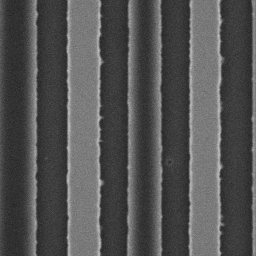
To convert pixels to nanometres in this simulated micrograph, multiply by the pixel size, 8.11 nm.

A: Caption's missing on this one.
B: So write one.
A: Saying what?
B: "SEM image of lines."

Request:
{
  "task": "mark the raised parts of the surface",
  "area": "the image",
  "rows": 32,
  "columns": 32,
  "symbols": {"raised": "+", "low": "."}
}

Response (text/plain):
+++++....++++...++++....+++.....
+++++....+++....++++....+++.....
+++++...++++....++++....++++....
+++++....++++...++++....+++.....
+++++...++++....++++....+++.....
+++++...++++....++++....+++.....
+++++...++++....++++....+++.....
+++++....++++...++++....++++....
+++++....++++...++++....++++....
+++++....+++....++++....++++....
+++++...+++++...++++....+++.....
+++++....+++....++++....+++.....
+++++....+++....++++....+++.....
+++++....+++....++++....+++.....
+++++....+++....++++....+++.....
+++++....+++....++++....++++....
+++++....+++....++++....++++....
+++++....+++....++++....++++....
+++++...++++....++++....+++.....
+++++....+++....++++....+++.....
+++++....+++....++++....+++.....
+++++....+++....++++....+++.....
++++....+++++...++++....+++.....
+++++....+++....++++....+++.....
+++++....++++...++++....+++.....
++++....++++....++++....++++....
++++.....+++....++++....+++.....
+++++....+++....++++....++++....
+++++....+++....++++....+++.....
++++....+++++...++++....+++.....
++++.....++++...++++....+++.....
++++.....+++....++++....+++.....